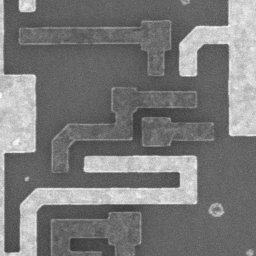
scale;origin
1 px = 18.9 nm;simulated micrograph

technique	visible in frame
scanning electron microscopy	wiring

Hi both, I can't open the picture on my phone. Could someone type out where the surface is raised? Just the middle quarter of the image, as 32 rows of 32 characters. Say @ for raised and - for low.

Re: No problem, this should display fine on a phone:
---------------------@@@@----@@@
---------------------@@@@----@@@
---------------------@@@@----@@@
--------------------------------
--------------------------------
--------------------------------
------------@@@@@@--------------
------------@@@@@@@@@@@@@@@@@@@@
------------@@@@@@@@@@@@@@@@@@@@
------------@@@@@@@@@@@@@@@@@@@@
------------@@@@@@@@@@@@@@@@@@@@
------------@@@@@@--------------
-------------@@@@---------------
-------------@@@@---------------
-------------@@@@---@@@@@@@-----
-@@@@@@@@@@@@@@@@---@@@@@@@@@@@@
@@@@@@@@@@@@@@@@@---@@@@@@@@@@@@
@@@@@@@@@@@@@@@@@---@@@@@@@@@@@@
@@@@@@@@@@@@@@@@@---@@@@@@@@@@@@
@@------------------@@@@@@@-----
@-------------------------------
@-------------------------------
@-------------------------------
@----@@@@@@@@@@@@@@@@@@@@@@@@@@@
@----@@@@@@@@@@@@@@@@@@@@@@@@@@@
@----@@@@@@@@@@@@@@@@@@@@@@@@@@@
@----@@@@@@@@@@@@@@@@@@@@@@@@@@@
-----------------------------@@@
-----------------------------@@@
-----------------------------@@@
-----------------------------@@@
@@@@@@@@@@@@@@@@@@@@@@@@@@@@@@@@